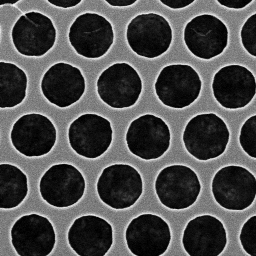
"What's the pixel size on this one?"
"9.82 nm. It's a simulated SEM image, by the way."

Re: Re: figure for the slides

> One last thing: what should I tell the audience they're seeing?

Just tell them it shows a regular array of holes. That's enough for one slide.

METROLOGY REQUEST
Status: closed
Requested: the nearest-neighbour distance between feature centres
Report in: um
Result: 0.555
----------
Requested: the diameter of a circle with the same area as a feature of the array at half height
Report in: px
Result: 44.2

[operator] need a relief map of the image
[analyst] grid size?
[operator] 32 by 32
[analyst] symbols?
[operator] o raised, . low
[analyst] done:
..ooooo...oooo..ooooo...oooo...o
oooooooooooooooooooooooooooooooo
oo....ooo....oooo....ooo...oooo.
oo.....oo.....oo.....oo.....oo..
o......oo.....oo......o.....oo..
oo.....oo.....oo.....oo.....oo..
oo....oooo...oooo....ooo....ooo.
oooooooooooooooooooooooooooooooo
..oooo....oooo...oooo...oooo...o
...oo.....oo.....ooo.....oo.....
...oo......o......o......oo.....
...oo.....oo......oo.....oo.....
...ooo....ooo....ooo....ooo....o
oooooooooooooo.ooooooooooooooooo
ooo..ooooo...ooooo.oooooo..ooooo
oo.....oo.....oo.....ooo....oo..
o......oo.....oo.....oo......o..
o......oo.....oo.....oo......o..
oo....ooo....ooo.....oo.....oo..
ooo.oooooo..ooooo...oooo...oooo.
ooooooooooooooo.oooooooooooooooo
...ooo....ooo....ooo....ooo....o
...oo......o......o......oo.....
...oo......o......o......oo.....
...oo.....oo......oo.....oo.....
..oooo...oooo....ooo....ooo....o
oooooooooooooooooooooooooooooooo
oo....oooo...oooo...oooo...oooo.
o......oo.....oo.....oo.....oo..
o......oo.....oo.....oo.....oo..
oo.....oo.....oo.....oo.....oo..
oo....oooo...oooo....oo.....ooo.